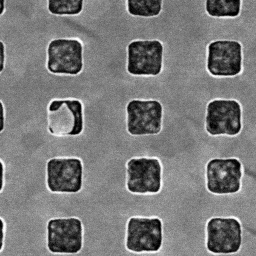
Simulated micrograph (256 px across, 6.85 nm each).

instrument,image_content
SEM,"a regular array of holes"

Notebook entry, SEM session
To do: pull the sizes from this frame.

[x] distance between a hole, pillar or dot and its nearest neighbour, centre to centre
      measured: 401 nanometres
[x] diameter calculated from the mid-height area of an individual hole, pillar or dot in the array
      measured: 257 nanometres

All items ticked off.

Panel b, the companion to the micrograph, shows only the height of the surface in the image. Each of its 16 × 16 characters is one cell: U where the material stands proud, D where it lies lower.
UUUDDUUUDDUUUDDU
UUUUUUUUUUUUUUUU
UUUUDUUUUUUUUUUU
UUUDDUUUDDUUUDDU
UUUDDUUUDDUUUDDU
UUUUUUUUUUUUUUUU
UUUDDUUUDDUUUDDU
UUUDDUUUDDUUUDDU
UUUUUUUUUUUUUUUU
UUUUUUUUUUUUUUUU
UUUDDUUUDDUUUDDU
UUUDDUUUDDUUUDDU
UUUUUUUUUUUUUUUU
UUUUUUUUUUUUUUUU
UUUDDUUUDDUUUDDU
UUUDDUUUDDUUUDDU